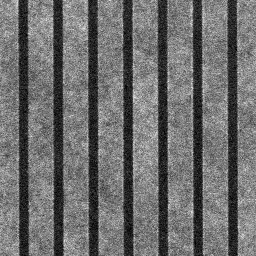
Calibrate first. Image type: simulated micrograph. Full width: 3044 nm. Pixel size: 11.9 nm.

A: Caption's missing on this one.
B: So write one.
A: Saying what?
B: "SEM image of parallel lines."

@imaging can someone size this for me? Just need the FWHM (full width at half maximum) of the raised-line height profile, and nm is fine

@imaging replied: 288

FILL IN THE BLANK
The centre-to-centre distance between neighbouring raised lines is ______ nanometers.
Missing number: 415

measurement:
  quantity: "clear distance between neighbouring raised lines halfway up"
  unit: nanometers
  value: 125